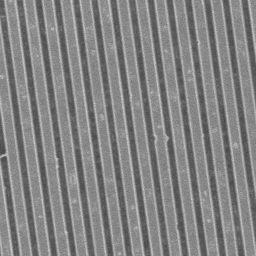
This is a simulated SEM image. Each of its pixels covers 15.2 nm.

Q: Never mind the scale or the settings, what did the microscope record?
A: parallel lines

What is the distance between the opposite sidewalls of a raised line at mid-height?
175 nm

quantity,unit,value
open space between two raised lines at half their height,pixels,6.69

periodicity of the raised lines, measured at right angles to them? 282 nanometers